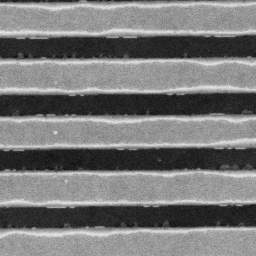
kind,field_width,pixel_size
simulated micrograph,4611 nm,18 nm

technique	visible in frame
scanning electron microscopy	lines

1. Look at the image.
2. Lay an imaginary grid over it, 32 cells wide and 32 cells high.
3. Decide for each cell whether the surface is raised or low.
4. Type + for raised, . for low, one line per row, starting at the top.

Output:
++.......+++..++++++++++++++++++
++++++++++++++++++++++++++++++++
++++++++++++++++++++++++++++++++
++++++++++++++++++++++++++++++++
................................
................................
................................
...........++....++++++++..++++.
++++++++++++++++++++++++++++++++
++++++++++++++++++++++++++++++++
++++++++++++++++++++++++++++++++
+++++++++++.+++++++++...........
................................
................................
................................
++++++++++++++++++++++++++++++++
++++++++++++++++++++++++++++++++
++++++++++++++++++++++++++++++++
................................
................................
................................
........+++++.++++++.+++++++....
++++++++++++++++++++++++++++++++
++++++++++++++++++++++++++++++++
++++++++++++++++++++++++++++++++
+++++++++++++++.................
................................
................................
.........................+++++++
++++++++++++++++++++++++++++++++
++++++++++++++++++++++++++++++++
++++++++++++++++++++++++++++++++